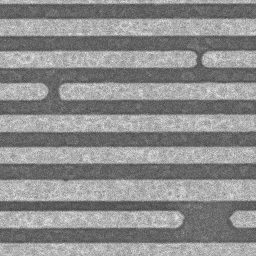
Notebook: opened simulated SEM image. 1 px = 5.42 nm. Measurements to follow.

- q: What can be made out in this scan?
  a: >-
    parallel lines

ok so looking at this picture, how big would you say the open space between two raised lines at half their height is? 0.0847 µm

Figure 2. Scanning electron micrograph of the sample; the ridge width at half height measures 89.5 nm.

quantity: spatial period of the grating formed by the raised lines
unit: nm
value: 174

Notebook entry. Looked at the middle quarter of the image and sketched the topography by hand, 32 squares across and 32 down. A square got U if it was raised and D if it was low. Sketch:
UUUUUUUUUUUUUUUUUUUUUUUUUUUUUUUU
DDDDDDDDDDDDDDDDDDDDDDDDDDDDDDDD
DDDDDDDDDDDDDDDDDDDDDDDDDDDDDDDD
DDDDDDDDDDDDDDDDDDDDDDDDDDDDDDDD
DDDDDDDDDDDDDDDDDDDDDDDDDDDDDDDD
UUUUUUUUUUUUUUUUUUUUUUUUUUUUUUUU
UUUUUUUUUUUUUUUUUUUUUUUUUUUUUUUU
UUUUUUUUUUUUUUUUUUUUUUUUUUUUUUUU
UUUUUUUUUUUUUUUUUUUUUUUUUUUUUUUU
DDDDDDDDDDDDDDDDDDDDDDDDDDDDDDDD
DDDDDDDDDDDDDDDDDDDDDDDDDDDDDDDD
DDDDDDDDDDDDDDDDDDDDDDDDDDDDDDDD
DDDDDDDDDDDDDDDDDDDDDDDDDDDDDDDD
UUUUUUUUUUUUUUUUUUUUUUUUUUUUUUUU
UUUUUUUUUUUUUUUUUUUUUUUUUUUUUUUU
UUUUUUUUUUUUUUUUUUUUUUUUUUUUUUUU
UUUUUUUUUUUUUUUUUUUUUUUUUUUUUUUU
DDDDDDDDDDDDDDDDDDDDDDDDDDDDDDDD
DDDDDDDDDDDDDDDDDDDDDDDDDDDDDDDD
DDDDDDDDDDDDDDDDDDDDDDDDDDDDDDDD
DDDDDDDDDDDDDDDDDDDDDDDDDDDDDDDD
UUUUUUUUUUUUUUUUUUUUUUUUUUUUUUUU
UUUUUUUUUUUUUUUUUUUUUUUUUUUUUUUU
UUUUUUUUUUUUUUUUUUUUUUUUUUUUUUUU
UUUUUUUUUUUUUUUUUUUUUUUUUUUUUUUU
DDDDDDDDDDDDDDDDDDDDDDDDDDDDDDDD
DDDDDDDDDDDDDDDDDDDDDDDDDDDDDDDD
DDDDDDDDDDDDDDDDDDDDDDDDDDDDDDDD
DDDDDDDDDDDDDDDDDDDDDDDDDDDDDDDD
UUUUUUUUUUUUUUUUUUUUUUUUUUUUUUUU
UUUUUUUUUUUUUUUUUUUUUUUUUUUUUUUU
UUUUUUUUUUUUUUUUUUUUUUUUUUUUUUUU